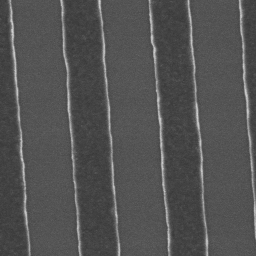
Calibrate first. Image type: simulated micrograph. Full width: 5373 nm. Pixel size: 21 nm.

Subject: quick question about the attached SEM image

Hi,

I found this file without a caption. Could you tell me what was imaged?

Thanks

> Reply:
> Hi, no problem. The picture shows one or a few lines or trenches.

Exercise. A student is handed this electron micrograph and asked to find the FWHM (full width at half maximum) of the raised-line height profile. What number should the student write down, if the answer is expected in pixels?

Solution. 39.4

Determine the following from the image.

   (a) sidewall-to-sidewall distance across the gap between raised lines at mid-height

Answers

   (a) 1030 nm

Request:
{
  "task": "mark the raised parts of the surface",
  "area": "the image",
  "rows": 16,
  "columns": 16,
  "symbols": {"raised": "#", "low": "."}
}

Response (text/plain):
#...##...###...#
#...##...###...#
#...##...###...#
#...###...##...#
#...###...##...#
#...###...##...#
#...###...##...#
#...###...##...#
#...###...###...
#...###...###...
#....##...###...
##...##...###...
##...##...###...
##...##...###...
##...##...###...
##...##....##...